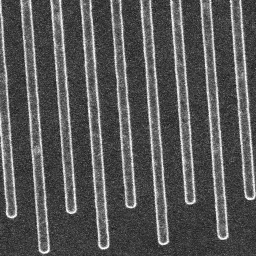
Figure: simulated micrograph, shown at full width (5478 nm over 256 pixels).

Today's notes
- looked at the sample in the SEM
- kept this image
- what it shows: parallel lines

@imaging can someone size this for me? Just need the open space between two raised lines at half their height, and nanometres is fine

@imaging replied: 430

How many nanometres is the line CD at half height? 195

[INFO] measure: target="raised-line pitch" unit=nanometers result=640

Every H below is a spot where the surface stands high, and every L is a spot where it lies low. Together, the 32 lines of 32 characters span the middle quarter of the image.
LLLLLHHHLLLLLHHLLLLLLHHLLLLLHHLL
LLLLLHHHLLLLLHHLLLLLLHHLLLLLHHLL
LLLLLLHHLLLLLHHLLLLLLHHLLLLLHHLL
LLLLLLHHLLLLLHHLLLLLLHHLLLLLHHLL
HLLLLLHHLLLLLHHHLLLLLHHLLLLLHHLL
HLLLLLHHLLLLLHHHLLLLLHHLLLLLHHLL
HLLLLLHHLLLLLHHHLLLLLHHLLLLLHHHL
HLLLLLHHLLLLLHHHLLLLLHHLLLLLLHHL
HLLLLLHHLLLLLLHHLLLLLHHLLLLLLHHL
HLLLLLHHLLLLLLHHLLLLLHHLLLLLLHHL
HLLLLLHHLLLLLLHHLLLLLHHHLLLLLHHL
HLLLLLHHHLLLLLHHLLLLLHHHLLLLLHHL
HLLLLLHHHLLLLLHHLLLLLHHLLLLLLHHL
HLLLLLHHHLLLLLHHLLLLLHHHLLLLLHHL
HLLLLLHHHLLLLLHHLLLLLLHHLLLLLHHL
HLLLLLLHHLLLLLHHLLLLLLHHLLLLLHHL
HLLLLLLHHLLLLLHHLLLLLLHHLLLLLHHH
HLLLLLLHHLLLLLHHHLLLLLHHLLLLLHHH
HHLLLLLHHLLLLLHHHLLLLLHHLLLLLHHH
HHLLLLLHHLLLLLHHHLLLLLHHLLLLLHHH
HHLLLLLHHLLLLLHHHLLLLLHHLLLLLLHH
HHLLLLLHHLLLLLLHHLLLLLHHLLLLLLHH
HHLLLLLHHLLLLLLHHLLLLLHHLLLLLLHH
HHLLLLLHHLLLLLLHHLLLLLHHLLLLLLHH
HHLLLLLHHHLLLLLHHLLLLLHHHLLLLLHH
HHLLLLLHHHLLLLLHHLLLLLHHHLLLLLHH
HHLLLLLHHHLLLLLHHLLLLLHHHLLLLLHH
HHLLLLLHHHLLLLLHHLLLLLLHHLLLLLHH
HHLLLLLLHHLLLLLHHLLLLLLHHLLLLLHH
HHLLLLLLHHLLLLLHHLLLLLLHHLLLLLHH
HHLLLLLLHHLLLLLHHHLLLLLHHLLLLLHH
HHHLLLLLHHLLLLLHHHLLLLLHHLLLLLHH